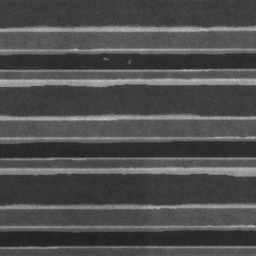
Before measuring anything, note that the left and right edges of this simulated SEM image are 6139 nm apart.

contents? lines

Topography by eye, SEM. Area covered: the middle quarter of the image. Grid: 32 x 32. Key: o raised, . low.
................................
................................
oooooooooooooooooooooooooooooooo
oooooooooooooooooooooooooooooooo
.oooooooooooo...................
................................
................................
................................
................................
................................
................................
................................
................................
................................
oooooooooooooooooooooooooooooooo
oooooooooooooooooooooooooooooooo
oooooooooooooooooooooooooooooooo
oooooooooooooooooooooooooooooooo
oooooooooooooooooooooooooooooooo
................................
................................
................................
................................
................................
oooooooooooooooooooooooooooooooo
oooooooooooooooooooooooooooooooo
oooooooooooooooooooooooooooooooo
................................
................................
................................
................................
................................